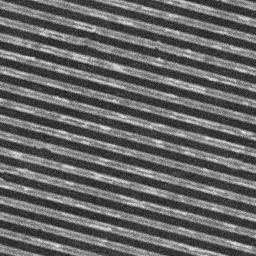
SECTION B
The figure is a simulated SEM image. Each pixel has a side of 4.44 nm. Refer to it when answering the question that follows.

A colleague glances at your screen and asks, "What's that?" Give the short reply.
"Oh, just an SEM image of parallel lines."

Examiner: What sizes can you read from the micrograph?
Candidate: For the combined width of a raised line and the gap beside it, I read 69.8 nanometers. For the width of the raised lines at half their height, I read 0.029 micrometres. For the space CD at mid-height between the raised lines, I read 0.0419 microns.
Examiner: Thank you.